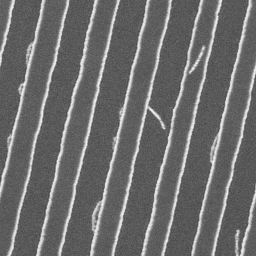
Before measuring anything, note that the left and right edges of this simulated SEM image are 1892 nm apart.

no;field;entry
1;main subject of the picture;lines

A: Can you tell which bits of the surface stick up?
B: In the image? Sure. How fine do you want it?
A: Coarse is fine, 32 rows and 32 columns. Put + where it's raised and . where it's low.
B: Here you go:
++...++++...+++...+++....+++...+
+....+++....+++...+++....++....+
+....+++...+++....+++....++....+
+....+++...+++....+++...+++...++
+...++++...+++...+++....+++...++
+...+++....+++...+++....++....++
....+++...+++....+++....++....++
....+++...+++....+++...+++....++
...++++...+++....+++...+++...+++
...+++....+++...+++....+++...+++
...+++....++....+++....++....+++
...+++...+++....+++....++....++.
...+++...+++....+++...+++...+++.
..+++....+++...+++....+++...+++.
..+++....+++...+++....++....+++.
..+++...+++....+++...+++....+++.
..+++...+++....+++...+++...+++..
.+++....+++....+++...+++...+++..
.+++....+++...+++....+++...+++..
.+++...+++....+++....++....+++..
.+++...+++....+++...+++....++...
.+++...+++....+++...+++...+++...
++++...+++...+++....+++...+++...
+++....+++...+++...+++....+++...
+++...+++....+++...+++....++....
+++...+++....+++...+++...+++....
++....+++...++++...+++...+++...+
++....+++...+++....+++...+++...+
++...+++....+++...+++....++....+
++...+++....+++...+++....++....+
++...+++....+++...+++...+++...++
+....+++...+++....+++...+++...++